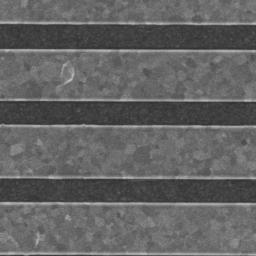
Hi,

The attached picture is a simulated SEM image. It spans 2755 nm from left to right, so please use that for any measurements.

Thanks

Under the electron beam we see one or a few lines or trenches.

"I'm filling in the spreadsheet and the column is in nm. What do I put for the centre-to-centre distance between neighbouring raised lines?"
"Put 826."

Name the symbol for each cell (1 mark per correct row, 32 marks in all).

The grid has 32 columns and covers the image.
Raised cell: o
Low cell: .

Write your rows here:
oooooooooooooooooooooooooooooooo
oooooooooooooooooooooooooooooooo
oooooooooooooooooooooooooooooooo
................................
................................
................................
oooooooooooooooooooooooooooooooo
oooooooooooooooooooooooooooooooo
oooooooooooooooooooooooooooooooo
oooooooooooooooooooooooooooooooo
oooooooooooooooooooooooooooooooo
oooooooooooooooooooooooooooooooo
............oooooooooooooooooooo
................................
................................
................................
oooooooooooooooooooooooooooooooo
oooooooooooooooooooooooooooooooo
oooooooooooooooooooooooooooooooo
oooooooooooooooooooooooooooooooo
oooooooooooooooooooooooooooooooo
oooooooooooooooooooooooooooooooo
................................
................................
................................
oo..............................
oooooooooooooooooooooooooooooooo
oooooooooooooooooooooooooooooooo
oooooooooooooooooooooooooooooooo
oooooooooooooooooooooooooooooooo
oooooooooooooooooooooooooooooooo
oooooooooooooooooooooooooooooooo